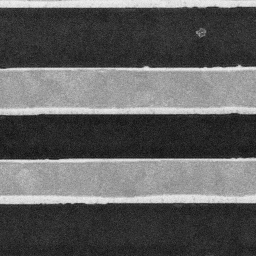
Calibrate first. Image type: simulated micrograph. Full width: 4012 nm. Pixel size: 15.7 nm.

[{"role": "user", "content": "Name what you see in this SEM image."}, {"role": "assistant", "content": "lines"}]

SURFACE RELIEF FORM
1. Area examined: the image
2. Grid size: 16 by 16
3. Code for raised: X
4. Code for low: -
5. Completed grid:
----------------
----------------
----------------
----------------
XXXXXXXXXXXXXXXX
XXXXXXXXXXXXXXXX
XXXXXXXXXXXXXXXX
----------------
----------------
----------------
XXXXXXXXXXXXXXXX
XXXXXXXXXXXXXXXX
XXXXXXXXXXX--XXX
----------------
----------------
----------------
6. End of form